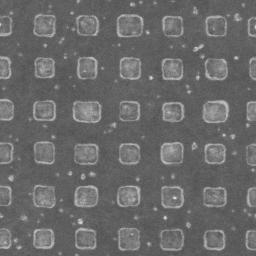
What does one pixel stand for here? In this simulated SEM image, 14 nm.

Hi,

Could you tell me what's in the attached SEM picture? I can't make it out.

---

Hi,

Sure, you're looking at a regular array of holes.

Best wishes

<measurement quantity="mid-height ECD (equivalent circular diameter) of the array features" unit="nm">295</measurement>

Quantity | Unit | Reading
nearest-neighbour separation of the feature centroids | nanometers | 590